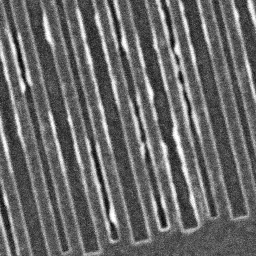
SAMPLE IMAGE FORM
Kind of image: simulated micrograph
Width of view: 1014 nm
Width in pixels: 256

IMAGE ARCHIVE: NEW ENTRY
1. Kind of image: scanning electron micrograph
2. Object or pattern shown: parallel lines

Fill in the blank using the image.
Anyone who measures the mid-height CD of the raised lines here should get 58.8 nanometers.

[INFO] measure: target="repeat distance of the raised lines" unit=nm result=101